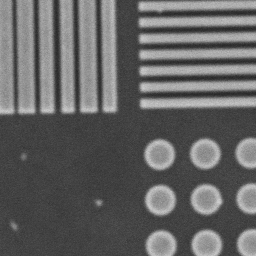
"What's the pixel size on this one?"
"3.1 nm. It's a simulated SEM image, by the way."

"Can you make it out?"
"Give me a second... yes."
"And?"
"groups of lines, slits or small figures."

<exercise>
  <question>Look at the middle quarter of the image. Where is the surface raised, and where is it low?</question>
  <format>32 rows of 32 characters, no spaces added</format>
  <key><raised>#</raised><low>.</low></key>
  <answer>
##..####..###...................
##..####..###......#############
##..####..###......#############
##..####..###...................
##..####..###...................
##..####..###......#############
##..####..###......#############
##..####..###...................
##..####..###...................
##..####..###......#############
##..####..###......#############
##..####..###...................
................................
................................
................................
................................
................................
................................
................................
......................####......
.....................######.....
.....................######.....
....................########....
.....................#######....
.....................######.....
......................####......
................................
................................
................................
................................
................................
.....................######.....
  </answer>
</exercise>